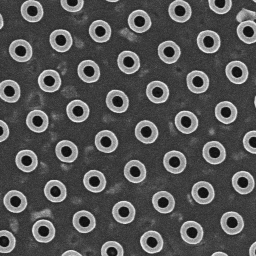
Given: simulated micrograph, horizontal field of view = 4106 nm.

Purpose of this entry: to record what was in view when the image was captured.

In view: a regular array of ring-shaped raised bodies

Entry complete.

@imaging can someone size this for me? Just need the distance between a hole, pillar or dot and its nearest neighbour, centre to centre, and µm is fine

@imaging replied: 0.655